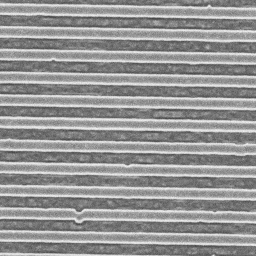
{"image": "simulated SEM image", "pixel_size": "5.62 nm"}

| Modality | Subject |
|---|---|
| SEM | parallel lines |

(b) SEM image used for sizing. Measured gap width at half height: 69.6 nanometres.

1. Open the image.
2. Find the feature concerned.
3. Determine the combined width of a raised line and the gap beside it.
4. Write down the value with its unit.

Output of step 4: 128 nm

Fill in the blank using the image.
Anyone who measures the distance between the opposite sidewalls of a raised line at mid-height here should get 58.3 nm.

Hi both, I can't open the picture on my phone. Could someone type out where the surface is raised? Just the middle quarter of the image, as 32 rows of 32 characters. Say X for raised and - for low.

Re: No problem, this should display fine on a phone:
--------------------------------
--------------------------------
XXXXXX--------------------------
XXXXXXXXXXXXXXXXXXXXXXXXXXXXXXXX
XXXXXXXXXXXXXXXXXXXXXXXXXXXXXXXX
--------------------------------
--------------------------------
--------------------------------
XXXXXXXXXXXXXXXXXXXXXXX---------
XXXXXXXXXXXXXXXXXXXXXXXXXXXXXXXX
--XXXXXXXXXXXXXXXXXXXXXXXXXXXXXX
--------------------------------
--------------------------------
--------------------------------
XXXXXXXXXXXXXXXXXXXXXXXXXXXXXXXX
XXXXXXXXXXXXXXXXXXXXXXXXXXXXXXXX
---------------------XXXXXXXX---
--------------------------------
--------------------------------
XX-X-XXXXXXXXXX-----------------
XXXXXXXXXXXXXXXXXXXXXXXXXXXXXXXX
XXXXXXXXXXXXXXXXXXXXXXXXXXXXXXXX
--------------------------------
--------------------------------
--------------------------------
XXXXXXXXXXXXXXXXXXXXXXXXXXXXX-XX
XXXXXXXXXXXXXXXXXXXXXXXXXXXXXXXX
XXX-------XXXXXXXXXXXXXXXXXXXXXX
--------------------------------
--------------------------------
--------------------------------
XXXXXXXXXXXXXXXXXXXXXXXXXXXXXXXX